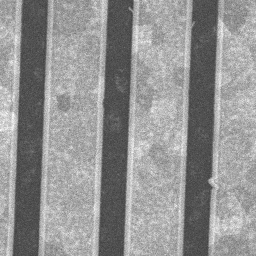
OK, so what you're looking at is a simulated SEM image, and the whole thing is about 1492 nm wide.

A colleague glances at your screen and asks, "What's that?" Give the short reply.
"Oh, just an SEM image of one or a few lines or trenches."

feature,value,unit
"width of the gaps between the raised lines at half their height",0.183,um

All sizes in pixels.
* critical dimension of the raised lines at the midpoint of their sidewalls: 53.1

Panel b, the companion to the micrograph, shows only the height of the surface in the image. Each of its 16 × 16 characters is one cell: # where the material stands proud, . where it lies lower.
#..####.####..##
#..####.####..##
#..###..####..##
#..###..####..##
#..###..####..##
#..###..####..##
#..###..####..##
#..###..####..##
#..###..####..##
#..###..###..###
#..###..###..###
#..###..###..###
#..###..###..###
#..###..###..###
#..###..###..###
#..###..###..###